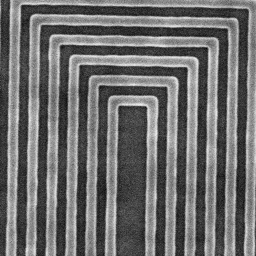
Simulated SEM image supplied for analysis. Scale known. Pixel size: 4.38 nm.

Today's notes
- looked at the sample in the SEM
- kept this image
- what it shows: groups of lines, slits or small figures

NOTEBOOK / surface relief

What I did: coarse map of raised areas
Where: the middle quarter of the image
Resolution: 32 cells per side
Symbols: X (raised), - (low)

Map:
--XX--------------------XXXXXXXX
-XXX---------------------------X
-XXX---------------------------X
-XXX---XXXXXXXXXXXXXXXXXXXXX---X
-XX---XXXXXXXXXXXXXXXXXXXXXX---X
-XX---XXX----------------XXX---X
-XX---XX------------------XX---X
-XX---XXX-----------------XX---X
-XXX--XX---XXXXXXXXXXXX---XX---X
-XXX--XX---XXXXXXXXXXXX---XX---X
-XX---XX---XXX------XXX---XX---X
-XX---XX---XX--------XX---XX---X
-XX---XX---XX--------XX---XX---X
-XX---XX---XX--------XX---XX---X
-XX---XX---XX--------XX---XX---X
-XX---XX---XX--------XX---XX---X
-XX---XX---XX--------XX---XX---X
-XX---XX---XX--------XX---XX---X
-XX---XX---XX--------XX---XX---X
-XX---XX---XX--------XX---XX---X
-XX---XX---XX--------XX---XX---X
-XX---XX---XX--------XX---XX---X
-XX---XX---XX--------XX---XX---X
-XX---XX---XX--------XX---XX---X
-XX---XX---XX--------XX---XX---X
-XX---XX---XX--------XX---XX---X
-XX---XX---XX--------XX---XX---X
-XX---XX---XX--------XX---XX---X
-XX---XX---XX--------XX---XX---X
-XX---XX---XX--------XX---XX---X
-XX---XX---XX--------XX---XX---X
-XX---XX---XX--------XX---XX---X